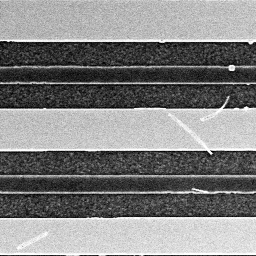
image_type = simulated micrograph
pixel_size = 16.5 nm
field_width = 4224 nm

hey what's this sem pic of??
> lines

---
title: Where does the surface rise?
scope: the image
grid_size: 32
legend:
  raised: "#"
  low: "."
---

################################
################################
################################
################################
################################
................................
................................
................................
.####.#######.#################.
################################
................................
................................
................................
...........................#..#.
################################
################################
################################
################################
################################
................................
................................
................................
################################
################################
................................
................................
................................
################################
################################
################################
################################
################################